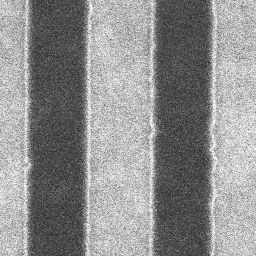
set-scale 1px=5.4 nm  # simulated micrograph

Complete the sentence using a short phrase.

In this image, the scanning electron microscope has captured one or a few lines or trenches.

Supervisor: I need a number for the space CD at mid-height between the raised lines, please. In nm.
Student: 329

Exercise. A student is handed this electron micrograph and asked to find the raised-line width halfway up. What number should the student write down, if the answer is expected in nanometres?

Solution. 348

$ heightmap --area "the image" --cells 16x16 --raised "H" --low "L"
LLHHHHLLLHHHHLLL
LLHHHHLLLHHHHLLL
LLHHHHLLLHHHHLLL
LLHHHHLLLHHHHLLL
LLHHHHLLLHHHHLLL
LLHHHHLLLHHHHLLL
LLHHHHLLLHHHHLLL
LLHHHHLLLHHHHLLL
LLHHHHLLLHHHHLLL
LLHHHHLLLHHHHLLL
LLHHHHLLLHHHHLLL
LLHHHHLLLHHHHLLL
LLHHHHLLLHHHHLLL
LLHHHHLLLHHHHLLL
LLHHHHLLLHHHHLLL
LLHHHHLLLHHHHLLL